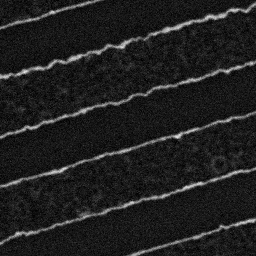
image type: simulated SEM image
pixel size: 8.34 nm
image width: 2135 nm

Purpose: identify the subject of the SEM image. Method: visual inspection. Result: one or a few lines or trenches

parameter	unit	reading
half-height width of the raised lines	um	0.457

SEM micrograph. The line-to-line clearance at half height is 395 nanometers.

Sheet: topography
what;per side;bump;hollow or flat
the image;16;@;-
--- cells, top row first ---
@@@@------------
@----------@@@@@
--------@@@@@@@@
-----@@@@@@@@@@@
-@@@@@@@@@@@@@--
@@@@@@@@@@------
@@@@@@@---------
@@@@----------@@
-----------@@@@@
-------@@@@@@@@@
----@@@@@@@@@@@@
-@@@@@@@@@@@@---
@@@@@@@@@-------
@@@@@@----------
@@-----------@@@
----------@@@@@@